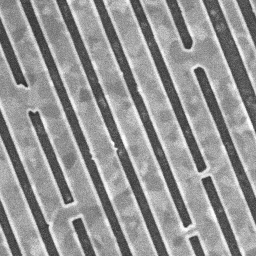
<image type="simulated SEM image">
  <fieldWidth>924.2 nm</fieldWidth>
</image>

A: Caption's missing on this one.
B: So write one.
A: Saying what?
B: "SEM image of parallel lines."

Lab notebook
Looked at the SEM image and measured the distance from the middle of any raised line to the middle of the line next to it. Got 123 nanometres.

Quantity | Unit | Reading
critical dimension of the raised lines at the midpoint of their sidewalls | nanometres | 81.2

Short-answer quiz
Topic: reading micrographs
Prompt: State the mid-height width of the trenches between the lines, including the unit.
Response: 42.3 nanometres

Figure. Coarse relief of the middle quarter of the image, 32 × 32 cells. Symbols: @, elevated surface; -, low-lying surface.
@@@@----@@@@@----@@@@@@---@@@@@@
@@@@@---@@@@@@---@@@@@@---@@@@@@
@@@@@---@@@@@@----@@@@@----@@@@@
@@@@@@---@@@@@@---@@@@@@---@@@@@
@@@@@@---@@@@@@---@@@@@@---@@@@@
@@@@@@----@@@@@----@@@@@@---@@@@
-@@@@@@---@@@@@@---@@@@@@---@@@@
-@@@@@@---@@@@@@---@@@@@@----@@@
--@@@@@@---@@@@@@---@@@@@@---@@@
--@@@@@@---@@@@@@---@@@@@@---@@@
--@@@@@@----@@@@@@---@@@@@@---@@
---@@@@@@---@@@@@@---@@@@@@---@@
---@@@@@@---@@@@@@----@@@@@----@
----@@@@@@---@@@@@@---@@@@@@---@
@---@@@@@@---@@@@@@---@@@@@@---@
@---@@@@@@----@@@@@@---@@@@@@---
@@---@@@@@@---@@@@@@---@@@@@@---
@@---@@@@@@---@@@@@@----@@@@@@--
@@----@@@@@@---@@@@@@---@@@@@@--
@@@---@@@@@@---@@@@@@---@@@@@@--
@@@---@@@@@@----@@@@@@---@@@@@@-
@@@@---@@@@@@---@@@@@@---@@@@@@-
@@@@---@@@@@@---@@@@@@----@@@@@-
@@@@---@@@@@@@---@@@@@@---@@@@@@
@@@@@---@@@@@@---@@@@@@---@@@@@@
@@@@@---@@@@@@----@@@@@@---@@@@@
@@@@@@---@@@@@@---@@@@@@---@@@@@
@@@@@@---@@@@@@---@@@@@@----@@@@
-@@@@@----@@@@@@---@@@@@@---@@@@
-@@@@@@---@@@@@@---@@@@@@---@@@@
-@@@@@@---@@@@@@----@@@@@@---@@@
--@@@@@@---@@@@@@---@@@@@@---@@@